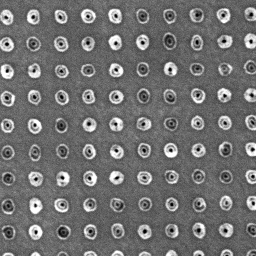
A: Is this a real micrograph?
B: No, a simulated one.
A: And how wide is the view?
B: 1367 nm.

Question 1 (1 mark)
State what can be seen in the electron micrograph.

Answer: a regular array of ring-shaped raised bodies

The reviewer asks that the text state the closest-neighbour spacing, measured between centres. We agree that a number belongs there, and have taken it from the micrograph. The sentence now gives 140 nanometers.